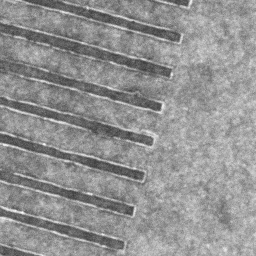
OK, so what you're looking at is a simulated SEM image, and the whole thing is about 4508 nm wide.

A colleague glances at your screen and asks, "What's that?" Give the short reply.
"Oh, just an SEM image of parallel lines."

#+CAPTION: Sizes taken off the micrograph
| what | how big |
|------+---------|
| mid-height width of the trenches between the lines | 0.444 um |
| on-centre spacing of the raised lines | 630 nanometers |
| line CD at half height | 189 nanometers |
